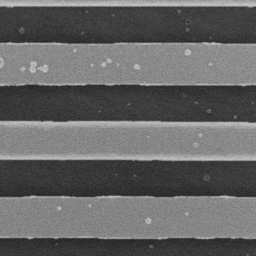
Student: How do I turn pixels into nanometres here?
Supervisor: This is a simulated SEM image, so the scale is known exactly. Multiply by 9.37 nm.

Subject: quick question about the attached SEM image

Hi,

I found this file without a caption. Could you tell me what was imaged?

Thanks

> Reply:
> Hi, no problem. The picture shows lines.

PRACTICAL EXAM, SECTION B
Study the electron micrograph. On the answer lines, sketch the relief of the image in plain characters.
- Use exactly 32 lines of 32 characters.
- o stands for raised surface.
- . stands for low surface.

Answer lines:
o..ooooooooooooooooooooooooooooo
................................
................................
................................
................................
oooooooo......oooooooooooooo....
oooooooooooooooooooooooooooooooo
oooooooooooooooooooooooooooooooo
oooooooooooooooooooooooooooooooo
oooooooooooooooooooooooooooooooo
ooo.ooooooo..oo..ooooooooooooooo
................................
................................
................................
................................
ooooo......ooo.o................
oooooooooooooooooooooooooooooooo
oooooooooooooooooooooooooooooooo
oooooooooooooooooooooooooooooooo
oooooooooooooooooooooooooooooooo
................................
................................
................................
................................
................................
oooooooooooooooooooooooooooooooo
oooooooooooooooooooooooooooooooo
oooooooooooooooooooooooooooooooo
oooooooooooooooooooooooooooooooo
oooooooooooooooooooooooooooooooo
................................
................................